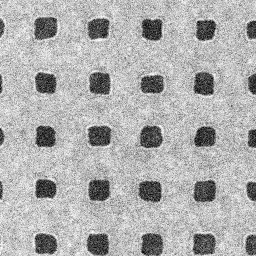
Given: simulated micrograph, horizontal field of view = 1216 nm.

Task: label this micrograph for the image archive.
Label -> a regular array of holes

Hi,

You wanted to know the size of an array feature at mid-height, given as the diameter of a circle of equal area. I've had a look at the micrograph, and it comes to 114 nanometers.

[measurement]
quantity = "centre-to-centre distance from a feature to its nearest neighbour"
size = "250 nanometres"